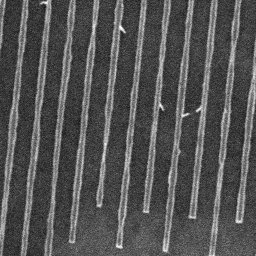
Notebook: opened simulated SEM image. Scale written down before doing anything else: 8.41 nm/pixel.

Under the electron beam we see parallel lines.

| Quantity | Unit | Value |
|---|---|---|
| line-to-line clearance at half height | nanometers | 151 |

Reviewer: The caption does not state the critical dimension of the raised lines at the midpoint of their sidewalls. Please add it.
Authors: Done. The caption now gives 0.0418 um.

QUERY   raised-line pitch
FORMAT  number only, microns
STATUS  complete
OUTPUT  0.197